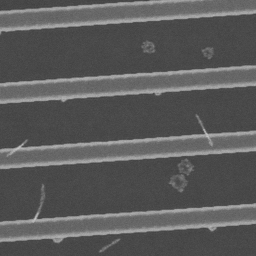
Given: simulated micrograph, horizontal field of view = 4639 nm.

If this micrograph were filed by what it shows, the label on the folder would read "lines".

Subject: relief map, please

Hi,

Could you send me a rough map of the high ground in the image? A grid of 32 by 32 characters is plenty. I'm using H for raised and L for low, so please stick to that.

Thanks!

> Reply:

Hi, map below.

LLLLLLLLLLLLLHHHHHHHHHHHHHHHHHHH
HHHHHHHHHHHHHHHHHHHHHHHHHHHHHHHH
HHHHHHHHHHHHHHHHHHHHLLLLLLLLLLLL
HHHHHLLLLLLLLLLLLLLLLLLLLLLLLLLL
LLLLLLLLLLLLLLLLLLLLLLLLLLLLLLLL
LLLLLLLLLLLLLLLLLLLLLLLLLLLLLLLL
LLLLLLLLLLLLLLLLLLLLLLLLLLLLLLLL
LLLLLLLLLLLLLLLLLLLLLLLLLLLLLLLL
LLLLLLLLLLLLLLLLLLLLLLLLLLLHHHHH
LLLLLLLLLLLLLLHHHHHHHHHHHHHHHHHH
HHHHHHHHHHHHHHHHHHHHHHHHHHHHHHHH
HHHHHHHHHHHHHHHHHHHHLLLLLLLLLLLL
HHHHHHLLLLLLLLLLLLLLLLLLLLLLLLLL
LLLLLLLLLLLLLLLLLLLLLLLLLLLLLLLL
LLLLLLLLLLLLLLLLLLLLLLLLLLLLLLLL
LLLLLLLLLLLLLLLLLLLLLLLLLLLLLLLL
LLLLLLLLLLLLLLLLLLLLLLLLLLLLLLLH
LLLLLLLLLLLLLLLLLHHHHHHHHHHHHHHH
LLHHHHHHHHHHHHHHHHHHHHHHHHHHHHHH
HHHHHHHHHHHHHHHHHHHHHHLLLLLLLLLL
HHHHHHHHLLLLLLLLLLLLLLLLLLLLLLLL
LLLLLLLLLLLLLLLLLLLLLLLLLLLLLLLL
LLLLLLLLLLLLLLLLLLLLLLLLLLLLLLLL
LLLLLLLLLLLLLLLLLLLLLLLLLLLLLLLL
LLLLLLLLLLLLLLLLLLLLLLLLLLLLLLLL
LLLLLLLLLLLLLLLLLLLLLLLLLLLLLLLL
LLLLLLLLLLLLLLLLLLLHHHHHHHHHHHHH
LLLLHHHHHHHHHHHHHHHHHHHHHHHHHHHH
HHHHHHHHHHHHHHHHHHHHHHHLLLLLLLLL
HHHHHHHHHHLLLLLLLLLLLLLLLLLLLLLL
LLLLLLLLLLLLLLLLLLLLLLLLLLLLLLLL
LLLLLLLLLLLLLLLLLLLLLLLLLLLLLLLL